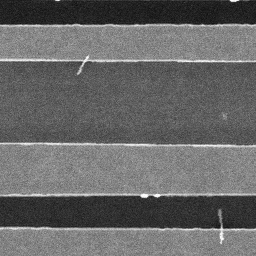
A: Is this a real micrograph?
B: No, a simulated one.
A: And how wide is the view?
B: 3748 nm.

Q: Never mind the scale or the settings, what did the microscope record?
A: lines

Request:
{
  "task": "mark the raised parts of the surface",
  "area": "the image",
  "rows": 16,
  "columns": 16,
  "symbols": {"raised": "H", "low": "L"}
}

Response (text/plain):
LLLLLLLLLLLLLLLL
LLLLLLLLLLLLLLLL
HHHHHHHHHHHHHHHH
HHHHHHHHHHHHHHHH
LLLLLLLLLLLLLLLL
LLLLLLLLLLLLLLLL
LLLLLLLLLLLLLLLL
LLLLLLLLLLLLLLLL
LLLLLLLLLLLLLLLL
HHHHHHHHHHHHHHHH
HHHHHHHHHHHHHHHH
HHHHHHHHHHHHHHHH
LLLLLLLLLLLLLLLL
LLLLLLLLLLLLLLLL
HHHHHHHHHHHHHHHH
HHHHHHHHHHHHHHHH